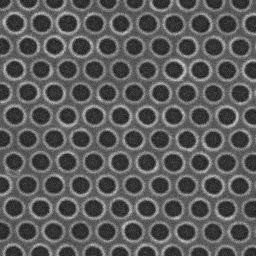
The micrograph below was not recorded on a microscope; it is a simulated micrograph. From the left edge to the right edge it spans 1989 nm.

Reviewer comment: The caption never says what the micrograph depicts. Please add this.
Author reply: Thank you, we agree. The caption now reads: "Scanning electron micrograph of a regular array of holes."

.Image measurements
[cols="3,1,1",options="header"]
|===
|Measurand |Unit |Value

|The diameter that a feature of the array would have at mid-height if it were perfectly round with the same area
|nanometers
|146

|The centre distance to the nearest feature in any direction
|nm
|204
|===